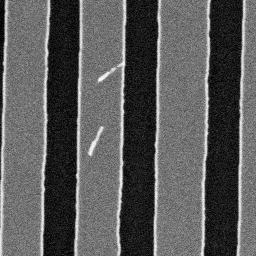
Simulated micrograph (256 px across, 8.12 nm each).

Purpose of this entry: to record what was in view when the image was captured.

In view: lines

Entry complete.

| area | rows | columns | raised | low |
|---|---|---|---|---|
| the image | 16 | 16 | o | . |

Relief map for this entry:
ooo..ooo..ooo..o
ooo..ooo..ooo..o
ooo..ooo..ooo..o
ooo..ooo..ooo..o
ooo..ooo..ooo..o
ooo..ooo..ooo..o
ooo..ooo..ooo..o
ooo..ooo..ooo..o
ooo..ooo..ooo..o
ooo..ooo..ooo..o
ooo..ooo..ooo..o
ooo..ooo..ooo..o
ooo..ooo..ooo..o
ooo..oo...ooo..o
ooo..oo...ooo..o
ooo..ooo..ooo..o